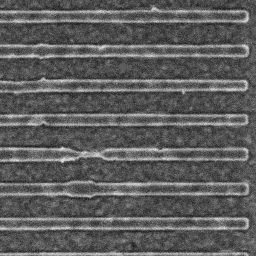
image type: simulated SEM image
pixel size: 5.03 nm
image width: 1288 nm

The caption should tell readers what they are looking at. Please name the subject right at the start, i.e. parallel lines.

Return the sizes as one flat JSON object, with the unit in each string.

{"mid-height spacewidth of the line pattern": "0.118 um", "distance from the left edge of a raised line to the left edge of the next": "34.5 px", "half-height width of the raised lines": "10.8 pixels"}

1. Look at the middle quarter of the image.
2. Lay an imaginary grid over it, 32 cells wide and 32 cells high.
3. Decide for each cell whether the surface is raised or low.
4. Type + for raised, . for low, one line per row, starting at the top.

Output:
................................
................................
................................
................................
++++++++++++++++++++++++++++++++
++++++++++++++++++++++++++++++++
++++++++++++++++++++++++++++++++
................................
................................
................................
................................
................................
................................
++++++++++++++++++++++++++++++++
++++++++++++++++++++++++++++++++
................................
................................
................................
................................
................................
................................
++........++++++++++++++++++++++
++++++++++++++++++++++++++++++++
+++.......++++++++++++++++++++++
................................
................................
................................
................................
................................
....+++.........................
++++++++++++++++++++++++++++++++
++++++++++++++++++++++++++++++++